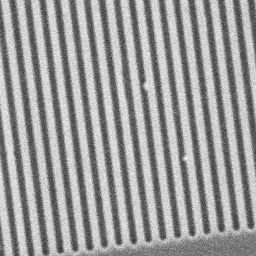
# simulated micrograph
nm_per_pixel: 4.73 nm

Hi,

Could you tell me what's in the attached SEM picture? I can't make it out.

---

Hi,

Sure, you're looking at parallel lines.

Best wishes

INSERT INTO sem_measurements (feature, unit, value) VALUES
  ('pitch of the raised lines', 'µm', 0.07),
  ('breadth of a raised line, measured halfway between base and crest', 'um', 0.0357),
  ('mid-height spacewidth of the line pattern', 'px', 7.67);